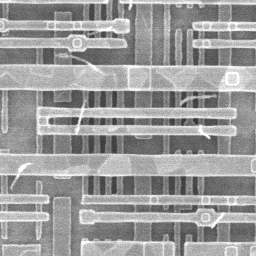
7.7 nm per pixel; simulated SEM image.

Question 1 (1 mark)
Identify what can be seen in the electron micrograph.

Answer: wiring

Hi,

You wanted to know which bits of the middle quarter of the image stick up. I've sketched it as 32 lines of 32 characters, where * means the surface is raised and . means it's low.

***********************.....****
********************************
********************************
********************************
********************************
********************************
..................**************
................................
................................
................................
................................
********************************
********************************
....*...................*******.
................................
*************************.......
********************************
********************************
................................
................................
................................
................................
......********..................
********************************
********************************
********************************
********************************
********************************
................................
................................
................................
................................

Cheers